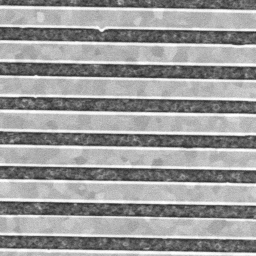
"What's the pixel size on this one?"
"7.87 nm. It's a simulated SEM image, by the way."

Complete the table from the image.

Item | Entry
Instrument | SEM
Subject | parallel lines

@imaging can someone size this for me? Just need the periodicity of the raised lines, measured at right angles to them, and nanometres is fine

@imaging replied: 273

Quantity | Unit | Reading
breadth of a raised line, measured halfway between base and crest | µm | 0.15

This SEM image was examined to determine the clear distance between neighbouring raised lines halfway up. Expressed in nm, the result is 123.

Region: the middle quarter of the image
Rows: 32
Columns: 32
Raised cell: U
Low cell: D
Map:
DDDDDDDDDDDDDDDDDDDDDDDDDDDDDDDD
DDDDDDDDDDDDDDDDDDDDDDDDDDDDDDDD
DDDDDDDDDDDDDDDDDDDDDDDDDDDDDDDD
UDDDDDDDDDDDDDDDDDDDDDDDDDDDDDDD
UUUUUUUUUUUUUUUUUUUUUUUUUUUUUUUU
UUUUUUUUUUUUUUUUUUUUUUUUUUUUUUUU
UUUUUUUUUUUUUUUUUUUUUUUUUUUUUUUU
UUUUUUUUUUUUUUUUUUUUUUUUUUUUUUUU
DDDDDDDDDDDDDDDDDDDDDDDDDDDUUUUU
DDDDDDDDDDDDDDDDDDDDDDDDDDDDDDDD
DDDDDDDDDDDDDDDDDDDDDDDDDDDDDDDD
DDDDDDDDDDDDDDDDDDDDDDDDDDDDDDDD
UUUUUUUUUUUUUUUUUUUDDDDDDDDDDDDD
UUUUUUUUUUUUUUUUUUUUUUUUUUUUUUUU
UUUUUUUUUUUUUUUUUUUUUUUUUUUUUUUU
UUUUUUUUUUUUUUUUUUUUUUUUUUUUUUUU
UUUUUUUUUUUUUUUUUUUUUUUUUUUUUUUU
DDDDDDDDDDDDDDDDDDDDDDDDDDDDDDDD
DDDDDDDDDDDDDDDDDDDDDDDDDDDDDDDD
DDDDDDDDDDDDDDDDDDDDDDDDDDDDDDDD
DDDDDDDDDDDDDDDDDDDDDDDDDDDDDDDD
UUUUUUUUUUUUUUUUUUUUUUUUUUUUUUUU
UUUUUUUUUUUUUUUUUUUUUUUUUUUUUUUU
UUUUUUUUUUUUUUUUUUUUUUUUUUUUUUUU
UUUUUUUUUUUUUUUUUUUUUUUUUUUUUUUU
DDDDDDDUUUUUUUUUUUUUUUUUUUUUUUUU
DDDDDDDDDDDDDDDDDDDDDDDDDDDDDDDD
DDDDDDDDDDDDDDDDDDDDDDDDDDDDDDDD
DDDDDDDDDDDDDDDDDDDDDDDDDDDDDDDD
DDDDDDDDDDDDDDDDDDDDDDDDDDDDDDDD
UUUUUUUUUUUUUUUUUUUUUUUUUUUUUUUU
UUUUUUUUUUUUUUUUUUUUUUUUUUUUUUUU